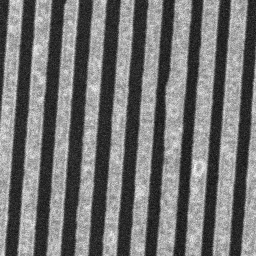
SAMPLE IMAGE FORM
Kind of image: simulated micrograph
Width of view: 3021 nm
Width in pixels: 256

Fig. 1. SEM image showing parallel lines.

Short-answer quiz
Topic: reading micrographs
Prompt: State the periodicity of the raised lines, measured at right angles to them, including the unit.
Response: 0.328 um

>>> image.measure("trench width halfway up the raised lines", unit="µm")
0.174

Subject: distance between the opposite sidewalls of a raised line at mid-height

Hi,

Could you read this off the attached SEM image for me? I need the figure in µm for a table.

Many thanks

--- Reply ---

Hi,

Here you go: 0.151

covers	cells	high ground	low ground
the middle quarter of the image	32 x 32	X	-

XX----XXX----XXX----XXX----XXXX-
XX----XXX----XXX----XXX----XXX--
XX----XXX----XXX----XXX----XXX--
XX----XXX----XXX----XXX---XXXX--
XX----XXX----XXX----XXX---XXXX--
XX----XXX----XXX----XXX---XXXX--
XX----XXX----XXX----XXX---XXXX--
XX----XXX----XXX----XXX---XXXX--
XX----XXX----XX-----XXX---XXXX--
XX----XX-----XX-----XXX---XXXX--
X-----XX-----XX-----XX----XXXX--
X----XXX-----XX----XXX----XXXX--
X----XXX----XXX----XXX----XXX---
X----XXX----XXX----XXX----XXX---
X----XXX----XXX----XXX----XXX---
X----XXX----XXX----XXX----XXX---
X----XXX----XXX----XXX---XXXX---
X----XXX----XXX----XXX---XXXX---
X----XXX----XXX----XXX---XXXX---
X----XXX----XXX----XXX---XXXX---
X----XXX----XXX----XXX---XXXX---
X----XXX----XXX----XXX----XXX---
X----XX-----XXX----XXX---XXXX---
X----XX-----XXX---XXXX---XXXX---
-----XX-----XX----XXX----XXXX---
-----XX-----XX----XXX----XXXX---
-----XX-----XX----XXX----XXX----
-----XX----XXX----XXX----XXXX---
----XXX----XXX----XXX----XXXX---
----XXX----XXX----XXX----XXX----
----XXX----XXX----XXX----XXX----
----XXX----XXX----XXX----XXX----